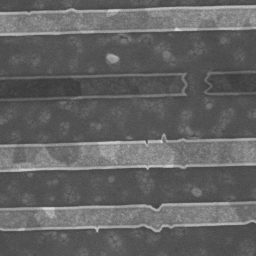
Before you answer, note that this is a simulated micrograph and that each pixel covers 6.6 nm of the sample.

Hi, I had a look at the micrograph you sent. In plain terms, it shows one or a few lines or trenches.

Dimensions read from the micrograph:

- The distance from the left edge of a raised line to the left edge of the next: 0.431 µm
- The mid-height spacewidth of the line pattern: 284 nm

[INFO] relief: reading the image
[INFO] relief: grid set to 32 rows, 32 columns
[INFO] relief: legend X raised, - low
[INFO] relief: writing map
--------------------------------
-------XXXXXXXXXXXXXXXXXXXXXXXXX
XXXXXXXXXXXXXXXXXXXXXXXXXXXXXXXX
XXXXXXXXXXXXXXXXXXXXXXXXXXXXXXXX
--------------------------------
--------------------------------
--------------------------------
--------------------------------
--------------------------------
----------------XXXXXXX---XXXXXX
XXXXXXXXXXXXXXXXXXXXXXX---XXXXXX
XXXXXXXXXXXXXXXXXXXXXXX---XXXXXX
--------------------------------
--------------------------------
--------------------------------
--------------------------------
--------------------------------
--------------------X-----------
XXXXXXXXXXXXXXXXXXXXXXXXXXXXXXXX
XXXXXXXXXXXXXXXXXXXXXXXXXXXXXXXX
XXXXXXXXXXXXXXXXXXXXXXXXXXXXXX--
--------------------------------
--------------------------------
--------------------------------
--------------------------------
----------------------------XXXX
XXXXXXXXXXXXXXXXXXXXXXXXXXXXXXXX
XXXXXXXXXXXXXXXXXXXXXXXXXXXXXXXX
XXXXXX-------------X------------
--------------------------------
--------------------------------
--------------------------------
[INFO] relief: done